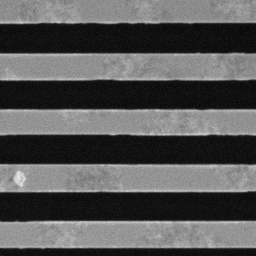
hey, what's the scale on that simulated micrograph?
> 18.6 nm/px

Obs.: lines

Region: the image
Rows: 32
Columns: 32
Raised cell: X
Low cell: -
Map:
XXXXXXXXXXXXXXXXXXXXXXXXXXXXXXXX
XXXXXXXXXXXXXXXXXXXXXXXXXXXXXXXX
XXXXXXXXXXXXXXXXXXXXXXXXXXXXXXXX
--------------------------------
--------------------------------
--------------------------------
--------------------------------
XXXXXXXXXXXXXXXXXXXXXXXXXXXXXXXX
XXXXXXXXXXXXXXXXXXXXXXXXXXXXXXXX
XXXXXXXXXXXXXXXXXXXXXXXXXXXXXXXX
--------------------------------
--------------------------------
--------------------------------
--------------------------------
XXXXXXXXXXXXXXXXXXXXXXXXXXXXXXXX
XXXXXXXXXXXXXXXXXXXXXXXXXXXXXXXX
XXXXXXXXXXXXXXXXXXXXXXXXXXXXXXXX
--------------------------------
--------------------------------
--------------------------------
--------------------------------
XXXXXXXXXXXXXXXXXXXXXXXXXXXXXXXX
XXXXXXXXXXXXXXXXXXXXXXXXXXXXXXXX
XXXXXXXXXXXXXXXXXXXXXXXXXXXXXXXX
--------------------------------
--------------------------------
--------------------------------
--------------------------------
XXXXXXXXXXXXXXXXXXXXXXXXXXXXXXXX
XXXXXXXXXXXXXXXXXXXXXXXXXXXXXXXX
XXXXXXXXXXXXXXXXXXXXXXXXXXXXXXXX
--------------------------------